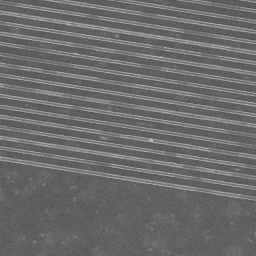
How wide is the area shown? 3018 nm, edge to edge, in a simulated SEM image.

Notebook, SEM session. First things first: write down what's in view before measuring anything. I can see parallel lines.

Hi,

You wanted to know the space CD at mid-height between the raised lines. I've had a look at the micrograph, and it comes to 82.9 nm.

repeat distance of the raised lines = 0.122 um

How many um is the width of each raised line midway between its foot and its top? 0.0422